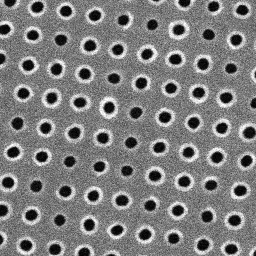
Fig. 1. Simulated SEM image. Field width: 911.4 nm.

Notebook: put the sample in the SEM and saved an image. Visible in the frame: a regular array of holes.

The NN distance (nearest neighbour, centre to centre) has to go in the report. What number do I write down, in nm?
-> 101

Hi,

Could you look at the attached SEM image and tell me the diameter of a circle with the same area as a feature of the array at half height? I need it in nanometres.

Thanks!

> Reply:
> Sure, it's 42.3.